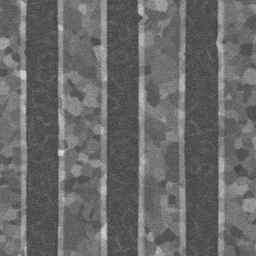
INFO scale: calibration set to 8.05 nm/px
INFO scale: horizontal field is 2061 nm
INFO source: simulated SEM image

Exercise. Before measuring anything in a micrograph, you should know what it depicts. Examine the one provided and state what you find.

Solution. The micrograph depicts one or a few lines or trenches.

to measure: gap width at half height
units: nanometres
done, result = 302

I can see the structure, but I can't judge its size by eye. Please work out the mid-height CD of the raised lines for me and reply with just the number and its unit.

341 nanometers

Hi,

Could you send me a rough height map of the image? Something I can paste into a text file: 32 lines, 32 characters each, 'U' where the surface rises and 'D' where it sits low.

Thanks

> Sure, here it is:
UUUDDDDDUUUUUDDDDDUUUUUDDDDDUUUU
UUUDDDDDUUUUUDDDDDUUUUUDDDDDUUUU
UUUDDDDDUUUUUDDDDDUUUUUDDDDDUUUU
UUUDDDDDUUUUUDDDDDUUUUUDDDDDUUUU
UUUDDDDDUUUUUDDDDDUUUUUDDDDDUUUU
UUUDDDDDUUUUUDDDDDUUUUUDDDDUUUUU
UUUDDDDDUUUUUDDDDDUUUUUDDDDDUUUU
UUUDDDDDUUUUUDDDDDUUUUUDDDDDUUUU
UUUDDDDDUUUUUDDDDDUUUUUDDDDDUUUU
UUUDDDDDUUUUUDDDDDUUUUUDDDDDUUUU
UUUDDDDDUUUUUDDDDDUUUUUDDDDDUUUU
UUUDDDDDUUUUUDDDDDUUUUUDDDDDUUUU
UUUDDDDDUUUUUDDDDDUUUUUDDDDDUUUU
UUUDDDDDUUUUUDDDDDUUUUUDDDDDUUUU
UUUDDDDDUUUUUDDDDDUUUUUDDDDDUUUU
UUUDDDDDUUUUUDDDDDUUUUUDDDDDUUUU
UUUDDDDDUUUUUDDDDDUUUUUDDDDDUUUU
UUUDDDDDUUUUUDDDDDUUUUUDDDDDUUUU
UUUDDDDDUUUUUDDDDDUUUUUDDDDDUUUU
UUUDDDDDUUUUUDDDDDUUUUUDDDDDUUUU
UUUDDDDDUUUUUDDDDDUUUUUDDDDDUUUU
UUUDDDDDUUUUUDDDDDUUUUUDDDDDUUUU
UUUDDDDDUUUUUDDDDDUUUUUDDDDDUUUU
UUUDDDDDUUUUUDDDDDUUUUUDDDDDUUUU
UUUDDDDDUUUUUDDDDDUUUUUDDDDDUUUU
UUUDDDDDUUUUUDDDDDUUUUUDDDDDUUUU
UUUDDDDDUUUUUDDDDDUUUUUDDDDDUUUU
UUUDDDDDUUUUUDDDDDUUUUUDDDDDUUUU
UUUDDDDDUUUUUDDDDDUUUUUDDDDDUUUU
UUUDDDDDUUUUUDDDDDUUUUUDDDDDUUUU
UUUDDDDDUUUUUDDDDDUUUUUDDDDDUUUU
UUUDDDDDUUUUUDDDDDUUUUUDDDDDUUUU